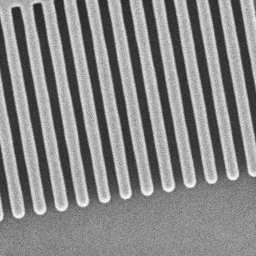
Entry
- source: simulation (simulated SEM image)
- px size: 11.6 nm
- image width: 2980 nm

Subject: groups of lines, slits or small figures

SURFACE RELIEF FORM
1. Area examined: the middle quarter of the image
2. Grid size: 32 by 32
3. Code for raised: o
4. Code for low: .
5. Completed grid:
...ooo..ooo...ooo..ooo...ooo..oo
...ooo...ooo..ooo...ooo..ooo...o
o..ooo...ooo..ooo...ooo..ooo...o
o..ooo...ooo..ooo...ooo..ooo...o
o...oo...ooo...ooo..ooo...ooo..o
o...ooo..ooo...ooo..ooo...ooo..o
o...ooo..ooo...ooo..ooo...ooo..o
oo..ooo...ooo..ooo...ooo..ooo...
oo..ooo...ooo..ooo...ooo..ooo...
oo..ooo...ooo..ooo...ooo..oooo..
oo..oooo..ooo...ooo..ooo...ooo..
oo...ooo..ooo...ooo..ooo...ooo..
oo...ooo..ooo...ooo..oooo..ooo..
ooo..ooo...ooo..ooo...ooo..ooo..
ooo..ooo...ooo..ooo...ooo..ooo..
ooo..ooo...ooo..ooo...ooo...oo..
ooo...ooo..ooo...ooo..ooo...ooo.
ooo...ooo..oooo..ooo..ooo...ooo.
oooo..ooo..oooo..ooo...oo...ooo.
oooo..ooo...ooo..ooo...ooo..ooo.
.ooo..ooo...ooo..ooo...ooo..ooo.
.ooo...oo...ooo..oooo..ooo...ooo
.ooo...ooo..ooo...ooo..ooo...ooo
.ooo...ooo..ooo...ooo...oo...ooo
..oo...ooo...oo...ooo...ooo..ooo
..ooo..ooo...ooo..ooo...ooo..ooo
..ooo..ooo...ooo...oo...ooo...oo
..ooo...ooo..ooo...oo...ooo...oo
..ooo...ooo..ooo...ooo..ooo...oo
..ooo...ooo..ooo...ooo..oooo..oo
..oooo..ooo...ooo..ooo...ooo...o
...ooo...oo...ooo..ooo...oo.....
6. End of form